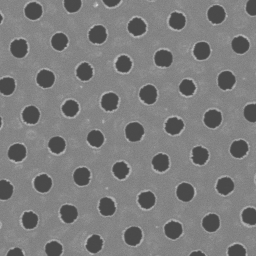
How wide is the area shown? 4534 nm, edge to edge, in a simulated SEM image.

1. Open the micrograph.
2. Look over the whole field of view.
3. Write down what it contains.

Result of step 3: a regular array of holes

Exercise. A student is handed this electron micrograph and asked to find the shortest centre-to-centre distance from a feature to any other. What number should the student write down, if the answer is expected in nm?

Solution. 689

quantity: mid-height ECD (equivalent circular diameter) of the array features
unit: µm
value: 0.319